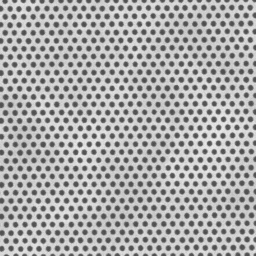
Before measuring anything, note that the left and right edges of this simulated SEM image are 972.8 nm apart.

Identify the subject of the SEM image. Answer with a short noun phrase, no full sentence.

a regular array of holes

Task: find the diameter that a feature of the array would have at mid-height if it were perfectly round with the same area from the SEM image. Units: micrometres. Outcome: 0.0227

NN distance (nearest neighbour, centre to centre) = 33.9 nm